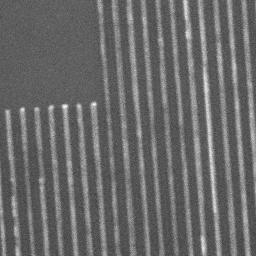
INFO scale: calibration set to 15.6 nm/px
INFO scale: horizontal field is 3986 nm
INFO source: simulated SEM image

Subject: parallel lines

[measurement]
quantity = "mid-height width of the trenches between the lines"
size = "182 nanometres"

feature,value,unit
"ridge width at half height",42.7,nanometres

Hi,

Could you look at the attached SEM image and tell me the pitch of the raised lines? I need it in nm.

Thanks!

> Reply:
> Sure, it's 222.